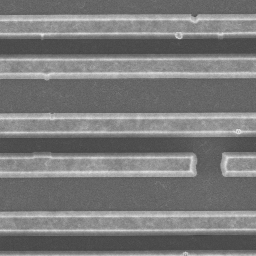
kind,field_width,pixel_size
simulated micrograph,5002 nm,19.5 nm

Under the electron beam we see parallel lines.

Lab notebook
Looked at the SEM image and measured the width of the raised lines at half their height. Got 0.369 um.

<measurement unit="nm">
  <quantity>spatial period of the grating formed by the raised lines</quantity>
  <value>960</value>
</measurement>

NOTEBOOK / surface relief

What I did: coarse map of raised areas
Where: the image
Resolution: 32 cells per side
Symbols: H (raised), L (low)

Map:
LLLLLLLLLLLLLLLLLLLLLLLLLLLLLLLL
LLLLLLLLLLLLLLLLLLLLLLLLLLLLLLLL
HHHHHHHHHHHHHHHHHHHHHHHHHHHHHHHH
HHHHHHHHHHHHHHHHHHHHHHHHHHHHHHHH
HHHHHHHHHHHHHHLLLLLLLHHLLLLHLLLL
LLLLLLLLLLLLLLLLLLLLLLLLLLLLLLLL
LLLLLLLLLLLLLLLLLLLLLLLLLLLLLLLL
HHHHHHHHHHHHHHHHHHHHHHHHHHHHHHHH
HHHHHHHHHHHHHHHHHHHHHHHHHHHHHHHH
HHHLLHHLLLLLLLLLLLLLLLLLLLLLLLLL
LLLLLLLLLLLLLLLLLLLLLLLLLLLLLLLL
LLLLLLLLLLLLLLLLLLLLLLLLLLLLLLLL
LLLLLLLLLLLLLLLLLLLLLLLLLLLLLLLL
LLLLLLLLLLLLLLLLLLLLLLLLLLLLLLLL
LLLLLLLLLLLLLLLLLLLLLLLLLLHHHHHH
HHHHHHHHHHHHHHHHHHHHHHHHHHHHHHHH
HHHHHHHHHHHHHHHHHHHHHHHHHHHHHHHH
LLLLLLLLLLLLLLLLLLLLLLLLLLLLLLLL
LLLLLLLLLLLLLLLLLLLLLLLLLLLLLLLL
LLLLHHHLLLLLLLLHHHHHHHHHLLLLHHHH
HHHHHHHHHHHHHHHHHHHHHHHHLLLLHHHH
HHHHHHHHHHHHHHHHHHHHHHHHLLLLHHHH
LLLLLLLLLLLLLLLLLLLLLLLLLLLLLLLL
LLLLLLLLLLLLLLLLLLLLLLLLLLLLLLLL
LLLLLLLLLLLLLLLLLLLLLLLLLLLLLLLL
LLLLLLLLLLLLLLLLLLLLLLLLLLLLLLLL
LLLLLLLLLLLLLLLLLLLLLLLLLLLLLLLL
HHHHHHHHHHHHHHHHHHHHHHHHHHHHHHHH
HHHHHHHHHHHHHHHHHHHHHHHHHHHHHHHH
LLLLLLLLLLLLLLLLLLLLLLLLLLLLLLLL
LLLLLLLLLLLLLLLLLLLLLLLLLLLLLLLL
LLLLLLLLLLLLLLLLLLLLLLLLLLLLLLLL